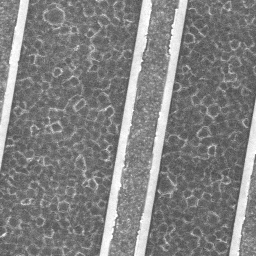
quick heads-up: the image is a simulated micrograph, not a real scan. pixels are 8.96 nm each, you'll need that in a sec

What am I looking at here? one or a few lines or trenches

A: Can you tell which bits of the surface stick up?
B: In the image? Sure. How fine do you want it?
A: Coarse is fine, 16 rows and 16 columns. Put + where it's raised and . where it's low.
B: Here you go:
+........++.....
+........++.....
+........++.....
+........++.....
+.......+++.....
+.......+++.....
........++......
........++......
........++......
........++......
.......+++.....+
.......+++.....+
.......++......+
.......++......+
.......++......+
.......++......+